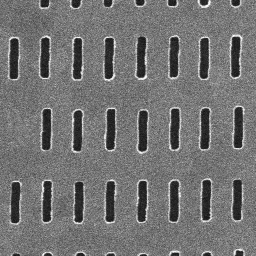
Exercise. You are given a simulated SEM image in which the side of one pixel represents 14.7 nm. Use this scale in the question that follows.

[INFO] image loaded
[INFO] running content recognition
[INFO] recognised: a regular array of holes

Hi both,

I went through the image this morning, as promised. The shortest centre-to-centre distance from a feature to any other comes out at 457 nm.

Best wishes